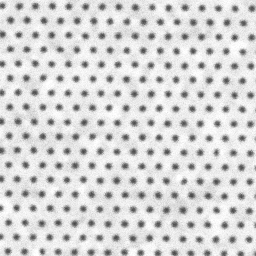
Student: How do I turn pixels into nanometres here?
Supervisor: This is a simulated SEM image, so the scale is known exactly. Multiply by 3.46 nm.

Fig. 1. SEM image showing a regular array of holes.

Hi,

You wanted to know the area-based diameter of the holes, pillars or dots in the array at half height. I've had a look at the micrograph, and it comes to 26.8 nm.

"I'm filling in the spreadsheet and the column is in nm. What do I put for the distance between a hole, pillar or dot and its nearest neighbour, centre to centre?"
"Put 55.6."